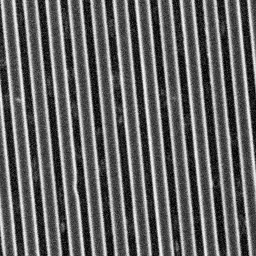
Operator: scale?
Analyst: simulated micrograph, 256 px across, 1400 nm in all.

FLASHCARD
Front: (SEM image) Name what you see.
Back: parallel lines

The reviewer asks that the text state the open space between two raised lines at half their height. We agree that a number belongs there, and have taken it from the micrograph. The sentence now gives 0.051 µm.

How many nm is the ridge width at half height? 72.1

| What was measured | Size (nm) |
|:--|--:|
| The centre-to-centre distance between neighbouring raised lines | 122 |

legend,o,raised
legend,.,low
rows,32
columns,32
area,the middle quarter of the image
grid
...ooo..oooo..ooo..oooo..ooo...o
...ooo..oooo..ooo...ooo..ooo...o
o..ooo...ooo..ooo...ooo..ooo...o
o..ooo...ooo..ooo...ooo..oooo..o
o..ooo...ooo..oooo..ooo...ooo..o
o..ooo...ooo...ooo..ooo...ooo..o
o..ooo...ooo...ooo..ooo...ooo..o
o..oooo..ooo...ooo..ooo...ooo...
o..oooo..ooo...ooo..ooo...ooo...
o...ooo..ooo...ooo..ooo...ooo...
o...ooo..ooo...ooo..oooo..ooo...
o...ooo..oooo..ooo...ooo..ooo...
oo..ooo...ooo..ooo...ooo..ooo...
oo..ooo...ooo..ooo...ooo..oooo..
oo..ooo...ooo..oooo..ooo...ooo..
oo..ooo...ooo..oooo..ooo...ooo..
oo..ooo...ooo...ooo..ooo...ooo..
oo..ooo...ooo...ooo..oooo..ooo..
oo..oooo..ooo...ooo..oooo..ooo..
oo...ooo..ooo...ooo..oooo..ooo..
oo...ooo..ooo...ooo...ooo..ooo..
oo...ooo..oooo..ooo...ooo..ooo..
ooo..ooo...ooo..ooo...ooo..ooo..
ooo..ooo...ooo..ooo...ooo..oooo.
ooo..ooo...ooo..oooo..ooo..oooo.
ooo..ooo...ooo..oooo..ooo...ooo.
ooo..ooo...ooo...ooo..ooo...ooo.
ooo..ooo...ooo...ooo..ooo...ooo.
ooo..oooo..ooo...ooo..oooo..ooo.
ooo...ooo..ooo...ooo..oooo..ooo.
ooo...ooo..ooo...ooo..oooo..ooo.
ooo...ooo..oooo..ooo..oooo..ooo.